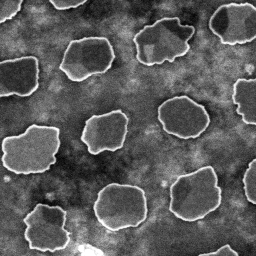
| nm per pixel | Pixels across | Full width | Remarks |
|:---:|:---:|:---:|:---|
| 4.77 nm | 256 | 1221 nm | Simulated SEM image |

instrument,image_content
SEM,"a regular array of raised bodies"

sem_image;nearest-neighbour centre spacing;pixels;76.3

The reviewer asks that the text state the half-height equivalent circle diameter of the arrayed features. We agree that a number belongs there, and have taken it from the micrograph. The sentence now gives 229 nm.